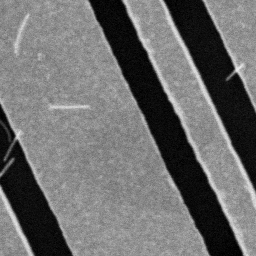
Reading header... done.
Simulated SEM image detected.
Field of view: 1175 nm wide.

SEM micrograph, lines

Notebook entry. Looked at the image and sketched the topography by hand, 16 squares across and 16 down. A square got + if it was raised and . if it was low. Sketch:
++++++..++...+++
++++++..+++..+++
+++++++..++...++
+++++++..+++..++
++++++++..++...+
++++++++..+++..+
+++++++++..++...
.++++++++..+++..
.++++++++...++..
..++++++++..+++.
..++++++++...++.
..+++++++++..+++
...++++++++...++
+..+++++++++..++
+...++++++++...+
++..+++++++++..+